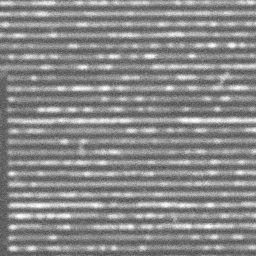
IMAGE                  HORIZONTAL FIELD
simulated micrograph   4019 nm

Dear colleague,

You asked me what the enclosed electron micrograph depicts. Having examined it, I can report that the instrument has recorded parallel lines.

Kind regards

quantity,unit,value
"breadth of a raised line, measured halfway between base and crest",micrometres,0.0383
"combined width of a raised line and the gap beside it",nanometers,168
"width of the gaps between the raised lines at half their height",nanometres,128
